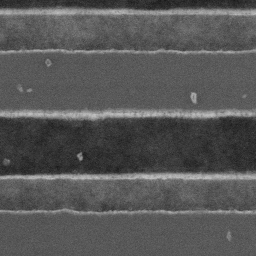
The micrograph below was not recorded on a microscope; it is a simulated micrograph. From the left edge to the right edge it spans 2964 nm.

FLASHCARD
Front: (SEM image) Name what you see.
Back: lines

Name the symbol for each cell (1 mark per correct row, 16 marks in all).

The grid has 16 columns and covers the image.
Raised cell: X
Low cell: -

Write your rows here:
----------------
XXXXXXXXXXXXXXXX
XXXXXXXXXXXXXXXX
XXXXXXXXXXXXXXXX
XXXXXXXXXXXXXXXX
XXXXXXXXXXXXXXXX
XXXXXXXXXXXXXXXX
----------------
----------------
----------------
----------------
XXXXXXXXXXXXXXXX
XXXXXXXXXXXXXXXX
XXXXXXXXXXXXXXXX
XXXXXXXXXXXXXXXX
XXXXXXXXXXXXXXXX